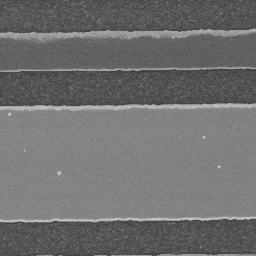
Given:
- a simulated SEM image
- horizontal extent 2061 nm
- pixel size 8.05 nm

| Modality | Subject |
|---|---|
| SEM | lines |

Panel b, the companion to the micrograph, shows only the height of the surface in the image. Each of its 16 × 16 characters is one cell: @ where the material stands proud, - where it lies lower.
----------------
----------------
@@@@@@@@@@@@@@@@
@@@@@@@@@@@@@@@@
----------------
----------------
----------------
@@@@@@@@@@@@@@@@
@@@@@@@@@@@@@@@@
@@@@@@@@@@@@@@@@
@@@@@@@@@@@@@@@@
@@@@@@@@@@@@@@@@
@@@@@@@@@@@@@@@@
@@@@@@@@@@@@@@@@
----------------
----------------